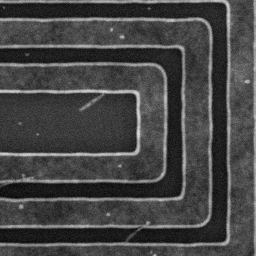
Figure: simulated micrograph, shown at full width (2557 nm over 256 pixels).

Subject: groups of lines, slits or small figures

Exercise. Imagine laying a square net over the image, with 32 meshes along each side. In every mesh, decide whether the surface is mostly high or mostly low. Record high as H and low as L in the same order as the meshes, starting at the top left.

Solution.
LLLLLLLLLLLLLLLLLLLLLLLLLLLLHHHH
LLLLLLLLLLLLLLLLLLLLLLLLLLLLLHHH
HHHHHLHHHHHHHHHHHHHHHLLHHLLLLHHH
HHHHHHHHHHHHHHHHHHHHHHHHHHLLLHHH
HHHHHHHHHHHHHHHHHHHHHHHHHHLLLHHH
HHHHHHHHHHHHHHHHHHHHHHHHHHLLLHHH
LLLLLLLLLLLLLLLLLLLLLLLHHHLLLHHH
LLLLLLLLLLLLLLLLLLLLLLLHHHLLLHHH
HHHHHHHHHHHHHHHHHHHHLLLHHHLLLHHH
HHHHHHHHHHHHHHHHHHHHHLLHHHLLLHHH
HHHHHHHHHHHHHHHHHHHHHLLHHHLLLHHH
LLLLLLLLLLLLLLLLHHHHHLLHHHLLHHHH
LLLLLLLLLLLLLLLLLHHHHLLHHHLLHHHH
LLLLLLLLLLLLLLLLLHHHHLLHHHLLLHHH
LLLLLLLLLLLLLLLLLHHHHLLHHHLLLHHH
LLLLLLLLLLLLLLLLLHHHHLLHHHLLLHHH
LLLLLLLLLLLLLLLLLHHHHLLHHHLLLHHH
LLLLLLLLLLLLLLLLLHHHHLLHHHLLLHHH
LLLLLLLLLLLLLLLLLHHHHLLHHHLLLHHH
HHHHHHHHHHHHHHHHHHHHHLLHHHLLLHHH
HHHHHHHHHHHHHHHHHHHHHLLHHHLLLHHH
HHHHHHHHHHHHHHHHHHHHLLLHHHLLLHHH
HHHHHHHHHHHHHHHHHHHHLLLHHHLLLHHH
LLLLLLLLLLLLLLLLLLLLLLLHHHLLLHHH
LLLLLLLLLLLLLLLLLLLLLLLHHHLLLHHH
HHHHHHHHHHHHHHHHHHHHHHHHHHLLLHHH
HHHHHHHHHHHHHHHHHHHHHHHHHHLLLHHH
HHHHHHHHHHHHHHHHHHHHHHHHHHLLLHHH
LLLLLLLLLLLLLLLLLLLLLLLLLLLLLHHH
LLLLLLLLLLLLLLLLLLLLLLLLLLLLLHHH
LLLLLLLLLLLLLLLLLLLLLLLLLLLLHHHH
HHHHHHHHHHHHHHHHHHHHHHHHHHHHHHHH